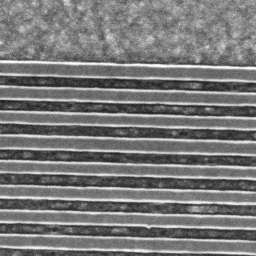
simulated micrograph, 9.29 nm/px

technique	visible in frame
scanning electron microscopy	parallel lines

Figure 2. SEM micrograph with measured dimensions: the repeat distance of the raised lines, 230 nm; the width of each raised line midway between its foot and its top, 115 nm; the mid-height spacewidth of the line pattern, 12.4 pixels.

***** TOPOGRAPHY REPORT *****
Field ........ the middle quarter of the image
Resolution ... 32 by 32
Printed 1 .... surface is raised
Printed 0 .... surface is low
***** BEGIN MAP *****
11111111111111111111111111000000
11111111111111111111111111111111
11111111111111111111111111111111
00000000000000111111100111111111
00000000000000000000000000000000
00000000000000000000000000000000
11111111111000000000000000000000
11111111111111111111111111111111
11111111111111111111111111111111
00000000000000010111111111111111
00000000000000000000000000000000
00000000000000000000000000000000
11111000000000000000000000000000
11111111111111111111111111111111
11111111111111111111111111111111
00000000000000000001111111111111
00000000000000000000000000000000
00000000000000000000000000000000
11111111000000000000000000000000
11111111111111111111111111111111
11111111111111111111111111111111
00000111111111111111111111111111
00000000000000000000000000000000
00000000000000000000000000000000
00000000000000000000000000000000
11111111111111111111111111111000
11111111111111111111111111111111
01110001111111111111111111111111
00000000000000000000000000000000
00000000000000000000000000000000
00000000000000000000000000000000
11111111111111111111111000000000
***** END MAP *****